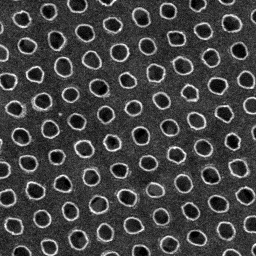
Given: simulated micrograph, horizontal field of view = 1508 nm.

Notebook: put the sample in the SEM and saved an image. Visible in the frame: a regular array of raised bodies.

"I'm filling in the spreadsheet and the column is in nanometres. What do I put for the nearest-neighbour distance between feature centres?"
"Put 164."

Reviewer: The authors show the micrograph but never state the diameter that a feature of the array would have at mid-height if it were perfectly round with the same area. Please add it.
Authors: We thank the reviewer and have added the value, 0.102 microns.